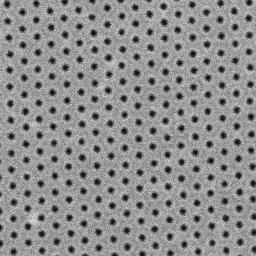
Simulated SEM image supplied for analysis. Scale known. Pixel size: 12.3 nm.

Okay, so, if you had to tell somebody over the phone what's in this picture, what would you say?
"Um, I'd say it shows a regular array of holes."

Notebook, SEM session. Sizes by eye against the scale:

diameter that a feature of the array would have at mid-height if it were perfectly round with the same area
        95.3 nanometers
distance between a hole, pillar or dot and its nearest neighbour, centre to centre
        194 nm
